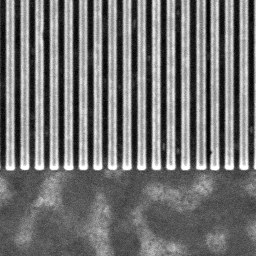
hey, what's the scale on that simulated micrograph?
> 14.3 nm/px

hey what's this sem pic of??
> parallel lines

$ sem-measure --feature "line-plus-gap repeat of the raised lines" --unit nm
209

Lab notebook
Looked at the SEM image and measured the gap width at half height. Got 109 nm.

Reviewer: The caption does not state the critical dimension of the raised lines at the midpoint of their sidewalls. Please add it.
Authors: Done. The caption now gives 96.7 nanometres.